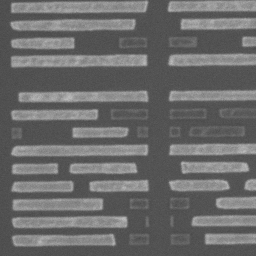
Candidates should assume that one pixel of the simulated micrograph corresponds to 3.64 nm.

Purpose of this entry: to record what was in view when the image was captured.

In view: wiring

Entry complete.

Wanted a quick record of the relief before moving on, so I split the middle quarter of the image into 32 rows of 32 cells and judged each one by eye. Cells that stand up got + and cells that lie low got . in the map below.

+++++...........................
................................
................................
................................
................................
................................
................................
+++++++++++++++++++++......+++++
+++++++++++++++++++++.....++++++
................................
................................
................................
++++++++....+++++++++......+++++
++++++++....+++++++++......+++..
................................
................................
..++++++++++++++...++......++...
..++++++++++++++...++......++...
................................
................................
...................++......+++++
+++++++++++++++++++++......+++++
+++++++++++++++++++++......+++++
................................
................................
..++++++++++++++++............++
..++++++++++++++++............++
................................
................................
++......+++++++++++++......+++++
++.....++++++++++++++......+++++
++.....++++++++++...+...........